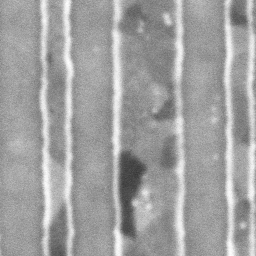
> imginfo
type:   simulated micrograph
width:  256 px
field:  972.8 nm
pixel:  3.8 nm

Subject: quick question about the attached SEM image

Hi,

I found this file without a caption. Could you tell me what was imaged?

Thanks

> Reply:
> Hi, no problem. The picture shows lines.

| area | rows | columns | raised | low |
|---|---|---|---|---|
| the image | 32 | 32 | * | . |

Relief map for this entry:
.....****......*******......***.
.....***.......*******......***.
.....***.......*******......***.
......***.....********......***.
.....****.....********......****
.....****......*******......****
.....***.......********......***
.....****......*******......****
......***......*******......****
.....****......*******......****
.....****......*******......***.
.....****......*******......***.
.....****......*******......****
.....****.....********......****
......***......*******.......***
......***.....********.......***
......***.....********......****
......***.....********.......***
......***.....********.......***
......***.....********......****
......***.....*********.....****
......***.....********.......***
......***.....********.......***
......***.....*********......***
......***.....*********......***
......***......********......***
......***......*******.......***
......***......*******.......***
......***......********......***
......***......********......***
......***......********......***
......***......********......***